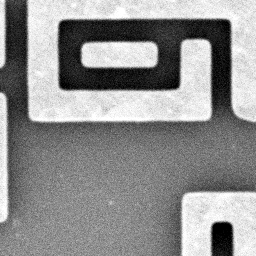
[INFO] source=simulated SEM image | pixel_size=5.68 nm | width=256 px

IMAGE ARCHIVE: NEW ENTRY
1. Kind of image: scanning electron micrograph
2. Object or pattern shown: wiring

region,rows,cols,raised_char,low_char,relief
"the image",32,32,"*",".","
....****************************
....****************************
....****.....................***
....***......................***
....***......................***
....***....********....***...***
....***...**********...***...***
....***...**********...***...***
....***................***...***
....***................***...***
....***................***...***
....**********************...***
*...**********************...***
*...**********************...***
*...**********************....**
*...............................
*...............................
*...............................
*...............................
*...............................
*...............................
*...............................
*...............................
*...............................
*......................*********
*......................*********
*......................*********
.......................*********
.......................***...***
.......................***...***
.......................***...***
.......................***...***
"